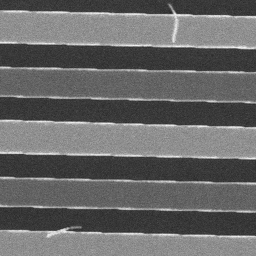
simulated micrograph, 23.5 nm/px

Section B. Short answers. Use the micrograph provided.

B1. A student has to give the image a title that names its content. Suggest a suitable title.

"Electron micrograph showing lines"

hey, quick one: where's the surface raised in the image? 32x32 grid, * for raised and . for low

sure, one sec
................................
****............................
********************************
********************************
********************************
..........**********************
................................
................................
**..............................
********************************
********************************
********************************
.....................***********
................................
................................
***************.................
********************************
********************************
********************************
....................************
................................
................................
************....................
********************************
********************************
********************************
................................
................................
................................
***************************.....
********************************
********************************